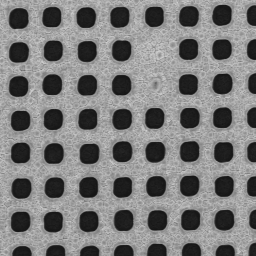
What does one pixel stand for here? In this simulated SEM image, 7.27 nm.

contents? a regular array of holes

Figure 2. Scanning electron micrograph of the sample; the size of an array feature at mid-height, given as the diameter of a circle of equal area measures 152 nanometres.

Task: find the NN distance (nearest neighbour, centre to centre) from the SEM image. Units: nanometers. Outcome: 242